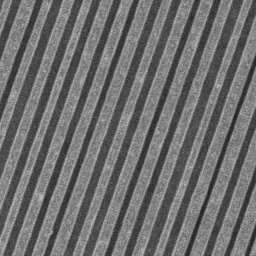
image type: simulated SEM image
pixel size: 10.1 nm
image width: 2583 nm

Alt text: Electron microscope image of parallel lines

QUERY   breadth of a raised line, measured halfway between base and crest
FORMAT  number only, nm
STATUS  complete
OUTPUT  102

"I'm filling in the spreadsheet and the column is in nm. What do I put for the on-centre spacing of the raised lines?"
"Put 190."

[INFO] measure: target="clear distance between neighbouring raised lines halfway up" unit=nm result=91.6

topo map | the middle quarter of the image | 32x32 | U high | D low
UDDDUUDDDUUDDUUUDDDUUDDDUUUDDUUD
UDDUUUDDUUUDDUUUDDDUUDDUUUDDUUUD
DDDUUUDDUUUDDUUUDDUUDDDUUUDDUUUD
DDDUUDDDUUUDUUUDDDUUDDDUUUDDUUDD
DDUUUDDUUUDDUUUDDDUUDDUUUDDUUUDD
DDUUUDDUUUDDUUUDDUUUDDUUUDDUUUDD
DUUUDDDUUDDUUUDDDUUDDDUUDDUUUDDD
DUUUDDUUUDDUUUDDUUUDDUUUDDUUUDDU
DUUUDDUUUDUUUUDDUUDDDUUUDDUUUDDU
UUUDDDUUDDUUUDDDUUDDDUUDDUUUDDUU
UUUDDUUUDDUUUDDUUUDDUUUDDUUUDDUU
UUUDDUUDDUUUUDDUUDDDUUUDDUUUDDUU
UUDDUUUDDUUUDDDUUDDUUUDDUUUDDUUU
UUDDUUUDDUUUDDUUDDDUUUDDUUUDDUUU
UDDDUUDDUUUDDDUUDDDUUUDDUUUDDUUD
UDDUUUDDUUUDDDUUDDUUUDDUUUDDUUUD
UDDUUUDDUUUDDUUUDDUUUDDUUUDDUUUD
UDDUUDDUUUDDDUUDDDUUUDDUUUDDUUDD
DDUUUDDUUUDDDUUDDUUUDDUUUDDUUUDD
DDUUUDDUUUDDUUUDDUUUDDUUUDDUUUDD
DUUUDDUUUDDDUUDDDUUUDDUUDDDUUDDD
DUUUDDUUUDDUUUDDUUUDDUUUDDUUUDDD
DUUUDDUUDDDUUUDDUUUDDUUUDDUUUDDD
UUUDDUUUDDDUUDDDUUUDUUUDDDUUDDDU
UUUDDUUUDDUUUDDUUUDDUUUDDUUUDDDU
UUUDDUUDDDUUDDDUUUDDUUUDDUUUDDDU
UUDDUUUDDDUUDDDUUDDUUUDDDUUDDDUU
UUDDUUUDDUUUDDUUUDDUUUDDUUUDDDUU
UUDUUUUDDUUDDDUUUDDUUUDDUUDDDDUD
UDDUUUDDDUUDDDUUDDUUUDDUUUDDDUUD
UDDUUUDDUUUDDUUUDDUUUDDUUUDDDUUD
DDUUUDDDUUDDDUUUDDUUUDDUUDDDDUDD